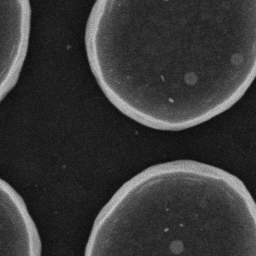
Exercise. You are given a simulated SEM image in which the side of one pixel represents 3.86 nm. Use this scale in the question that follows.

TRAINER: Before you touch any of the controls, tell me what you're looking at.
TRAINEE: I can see raised bodies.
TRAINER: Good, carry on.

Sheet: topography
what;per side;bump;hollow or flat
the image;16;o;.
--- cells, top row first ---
oo....oooooooooo
oo....oooooooooo
oo....oooooooooo
o.....oooooooooo
o.....oooooooooo
.......oooooooo.
........oooooo..
.........oooo...
................
................
..........ooo...
........ooooooo.
o......ooooooooo
oo.....ooooooooo
oo....oooooooooo
oo....oooooooooo